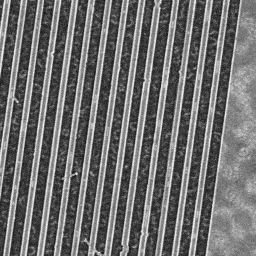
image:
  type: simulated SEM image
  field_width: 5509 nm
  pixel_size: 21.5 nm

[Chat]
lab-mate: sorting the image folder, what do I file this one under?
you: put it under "parallel lines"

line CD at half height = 98.6 nanometers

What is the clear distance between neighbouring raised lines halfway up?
258 nm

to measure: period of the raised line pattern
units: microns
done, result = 0.359